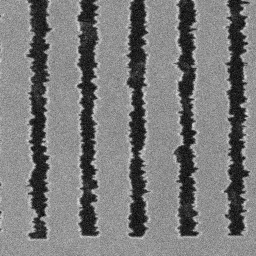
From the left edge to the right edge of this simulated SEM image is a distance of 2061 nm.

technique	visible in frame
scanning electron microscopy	parallel lines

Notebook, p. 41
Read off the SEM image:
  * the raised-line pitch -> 396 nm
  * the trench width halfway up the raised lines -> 134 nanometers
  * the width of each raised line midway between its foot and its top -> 262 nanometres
